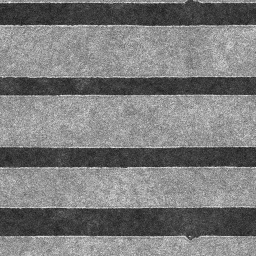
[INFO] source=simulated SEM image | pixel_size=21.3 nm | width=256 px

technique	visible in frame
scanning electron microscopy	one or a few lines or trenches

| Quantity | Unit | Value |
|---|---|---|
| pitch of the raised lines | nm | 1450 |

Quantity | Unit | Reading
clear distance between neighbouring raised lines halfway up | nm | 461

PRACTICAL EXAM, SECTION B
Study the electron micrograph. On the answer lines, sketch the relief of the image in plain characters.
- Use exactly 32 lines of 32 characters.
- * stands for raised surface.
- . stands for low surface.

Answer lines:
................................
................................
................................
********************************
********************************
********************************
********************************
********************************
********************************
********************************
................................
................................
********************************
********************************
********************************
********************************
********************************
********************************
................................
................................
................................
********************************
********************************
********************************
********************************
********************************
................................
................................
................................
................................
********************************
********************************